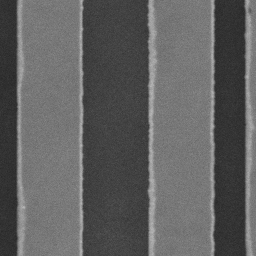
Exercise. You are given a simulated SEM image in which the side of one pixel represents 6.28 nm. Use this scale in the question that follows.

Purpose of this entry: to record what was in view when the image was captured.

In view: lines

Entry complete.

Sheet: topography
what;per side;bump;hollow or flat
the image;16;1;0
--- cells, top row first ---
0111100001111001
0111100001111001
0111100001111001
0111100001111001
0111100001111001
0111100001111001
0111100001111001
0111100001111001
0111100001111001
0111100001111001
0111100001111001
0111100001111001
0111100001111001
0111100001111001
0111100001111001
0111100001111001